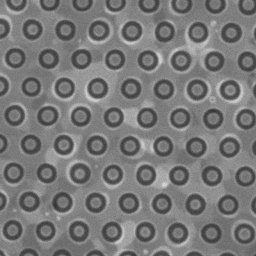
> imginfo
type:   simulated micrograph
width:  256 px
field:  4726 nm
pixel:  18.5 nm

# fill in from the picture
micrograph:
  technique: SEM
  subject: an array of small figures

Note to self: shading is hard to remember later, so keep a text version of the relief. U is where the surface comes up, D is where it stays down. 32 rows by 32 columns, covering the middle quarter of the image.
UUDDDDUUUUUDDDDUUUUDDDDDUUUDDDDD
UUUUDUUUUUUUDDUUUUUUDDDUUUUUDDDU
UUUUUUUUUUUUUUUUUUUUUUUUUUUUUUUU
DUUUUUUUDUUUUUUUDUUUUUUUUUUUUUUU
DDUUUUDDDDDUUUUDDDDUUUUDDDDUUUUD
DDDUUUDDDDDUUUDDDDDUUUUDDDDDUUUD
DDDUUUDDDDDUUUDDDDDDUUDDDDDDUUDD
DDDUUUDDDDDUUUDDDDDUUUUDDDDDUUDD
DDUUUUDDDDUUUUUDDDUUUUUDDDDUUUUD
UUUUUUUUUUUUUUUUUUUUUUUUUUUUUUUU
UUUDDUUUUUUUUUUUUUUUUUUUUUUUUUUU
UUDDDDDUUUUDDDUUUUUDDDUUUUUDDDDU
UUDDDDDUUUDDDDDUUUDDDDDUUUUDDDDU
UUDDDDDUUUDDDDDUUUDDDDDDUUDDDDDD
UUDDDDUUUUDDDDDUUUDDDDDUUUDDDDDD
UUUDDDUUUUUDDDUUUUUDDDUUUUUDDDDU
UUUUUUUUUUUUUUUUUUUUUUUUUUUUUUUU
UUUUUUUUUUUUUUUUUUUUUUUUUUUUUUUU
DDUUUUDDDDUUUUUDDDUUUUUDDDUUUUUU
DDDUUUDDDDDUUUDDDDDUUUDDDDDUUUUD
DDDUUUDDDDDUUUDDDDDDUUDDDDDUUUDD
DDDUUUDDDDDUUUDDDDDDUUDDDDDUUUDD
DDUUUUDDDDUUUUUDDDDUUUUDDDDUUUUD
UUUUUUUUUUUUUUUUUUUUUUUUUUUUUUUU
UUUDDUUUUUUUUUUUUUUUUUUUUUUUUUUU
UDDDDDUUUUUDDDUUUUUDDDUUUUUUDDUU
UDDDDDDUUUDDDDDUUUDDDDDUUUUDDDDU
UDDDDDDUUUDDDDDUUUDDDDDUUUDDDDDU
UDDDDDDUUUDDDDDUUUDDDDDUUUDDDDDU
UUDDDDUUUUDDDDUUUUDDDDDUUUUDDDDU
UUUUUUUUUUUDDUUUUUUUDUUUUUUUDDUU
UUUUUUUUUUUUUUUUUUUUUUUUUUUUUUUU